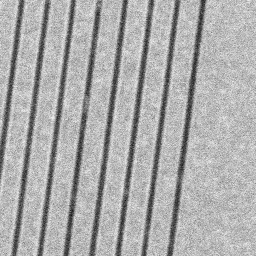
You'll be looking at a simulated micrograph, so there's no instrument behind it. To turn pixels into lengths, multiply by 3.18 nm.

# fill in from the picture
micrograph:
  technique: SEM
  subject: parallel lines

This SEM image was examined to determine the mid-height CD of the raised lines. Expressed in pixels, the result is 18.8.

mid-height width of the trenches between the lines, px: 6.67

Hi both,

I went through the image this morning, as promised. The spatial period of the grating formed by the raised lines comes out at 81.6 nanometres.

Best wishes